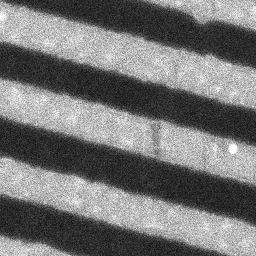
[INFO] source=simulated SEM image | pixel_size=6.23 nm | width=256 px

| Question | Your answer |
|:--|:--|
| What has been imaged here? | one or a few lines or trenches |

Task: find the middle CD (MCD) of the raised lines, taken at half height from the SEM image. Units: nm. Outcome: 253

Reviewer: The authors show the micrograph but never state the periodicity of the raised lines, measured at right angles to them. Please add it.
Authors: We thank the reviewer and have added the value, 466 nanometers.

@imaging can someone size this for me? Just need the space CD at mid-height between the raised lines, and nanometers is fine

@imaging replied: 208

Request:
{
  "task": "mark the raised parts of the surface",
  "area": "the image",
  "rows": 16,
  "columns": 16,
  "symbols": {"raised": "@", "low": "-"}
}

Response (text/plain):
-@@@@@@@@@@-----
-----@@@@@@@@@@-
---------@@@@@@@
@@@@--------@@@@
@@@@@@@@--------
--@@@@@@@@@-----
------@@@@@@@@@-
@--------@@@@@@@
@@@@@--------@@@
@@@@@@@@@-------
--@@@@@@@@@@----
------@@@@@@@@@@
@@--------@@@@@@
@@@@@@-------@@@
@@@@@@@@@-------
---@@@@@@@@@@---